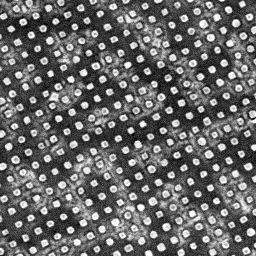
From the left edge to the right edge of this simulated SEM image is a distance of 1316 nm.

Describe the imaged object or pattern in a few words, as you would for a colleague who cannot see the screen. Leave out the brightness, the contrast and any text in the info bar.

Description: a regular array of raised bodies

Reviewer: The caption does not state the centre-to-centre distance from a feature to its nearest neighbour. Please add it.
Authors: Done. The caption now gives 71.5 nm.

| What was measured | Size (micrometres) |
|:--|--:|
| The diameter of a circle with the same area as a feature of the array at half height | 0.0296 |